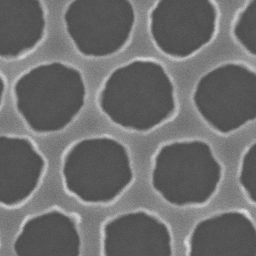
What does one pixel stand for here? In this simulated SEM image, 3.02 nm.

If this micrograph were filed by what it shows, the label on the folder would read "holes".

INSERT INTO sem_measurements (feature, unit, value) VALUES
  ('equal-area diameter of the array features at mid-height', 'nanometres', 205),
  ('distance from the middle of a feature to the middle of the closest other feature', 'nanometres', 259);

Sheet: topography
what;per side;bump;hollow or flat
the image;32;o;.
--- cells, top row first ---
.....oooo.......oooo......ooooo.
.....ooo.........oo........ooo..
......oo.........oo........ooo..
......oo.........oo........oo...
.....oooo.......ooo........oo...
....ooooo......ooooo......oooo..
...ooooooo....ooooooo...ooooooo.
oooooooooooooooooooooooooooooooo
oooo.....oooooo.....ooooooo....o
ooo.......oooo.......ooooo......
oo........ooo........oooo.......
oo.........oo.........oo........
oo........oo..........oo........
oo........ooo.........ooo.......
ooo......ooooo.......oooo.......
oooo....ooooooo.....oooooo....oo
oooo..oooooooooooooooooooooo.ooo
...oooooooo...oooooooooooooooooo
....ooooo.......oooo......ooooo.
.....ooo........oooo.......oooo.
.....ooo........ooo........ooo..
.....ooo........ooo.........oo..
.....ooo........ooo........ooo..
....oooo.......oooo........oooo.
...ooooooo.....ooooo......ooooo.
o.oooooooooooooooooooo..oooooooo
oooooooooooooooooooooooooooooooo
oooo.....ooooo......oooooo.....o
ooo.......ooo........ooo........
oo........ooo........ooo........
oo........ooo........ooo........
oo........ooo........ooo........